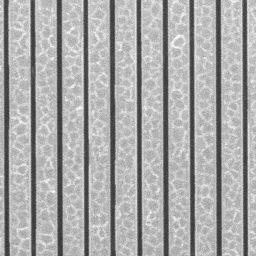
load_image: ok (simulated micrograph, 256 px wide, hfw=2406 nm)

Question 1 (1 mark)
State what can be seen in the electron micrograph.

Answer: parallel lines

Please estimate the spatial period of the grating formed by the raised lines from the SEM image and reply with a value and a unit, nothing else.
249 nanometres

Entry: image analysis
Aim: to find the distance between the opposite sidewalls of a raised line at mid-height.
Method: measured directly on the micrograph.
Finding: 20.6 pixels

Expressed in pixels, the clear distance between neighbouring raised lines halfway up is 6.26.